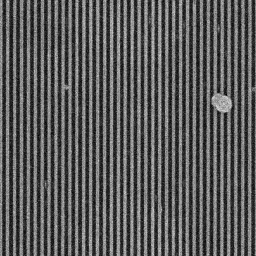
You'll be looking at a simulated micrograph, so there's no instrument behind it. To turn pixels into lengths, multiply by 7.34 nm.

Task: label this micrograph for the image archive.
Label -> parallel lines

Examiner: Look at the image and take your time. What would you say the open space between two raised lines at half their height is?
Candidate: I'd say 4.13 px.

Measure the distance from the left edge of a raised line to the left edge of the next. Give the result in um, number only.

0.0507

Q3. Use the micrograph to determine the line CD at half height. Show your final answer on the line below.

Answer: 20.2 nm